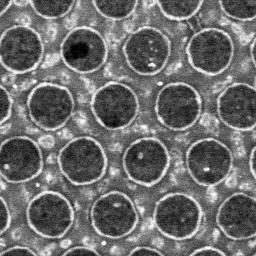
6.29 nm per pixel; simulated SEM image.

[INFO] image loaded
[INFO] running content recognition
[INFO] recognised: a regular array of raised bodies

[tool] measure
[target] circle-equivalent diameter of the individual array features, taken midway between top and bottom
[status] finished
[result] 287 nanometers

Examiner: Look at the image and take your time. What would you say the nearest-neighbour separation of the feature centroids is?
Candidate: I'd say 395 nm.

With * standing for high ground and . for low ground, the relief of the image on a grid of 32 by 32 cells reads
*...*****...*****...*****...****
.....***....*****...*****...****
.......................**.......
.***..............*.....*.......
*****...*****...****....*****...
*****...*****...*****...*****...
*****...*****...*****..******..*
*****...*****...*****...*****...
.***.....***....****....****....
................................
.....**.......*......**.........
*...*****...*****...*****...****
*...*****...*****...*****..*****
*...*****...*****..******..*****
*...*****...*****...*****..*****
.....***.....***....****....****
................................
.***.....***.....***......*.....
*****...*****...*****...****....
*****..******...*****..******..*
*****..******...*****..******..*
*****...*****...*****...*****..*
.***.....***.....***....****....
................................
.....***.....***.....**......**.
*...*****...*****...*****...****
*..******...*****..******..*****
*..******...*****..******..*****
*...*****...*****...*****...****
......**.....**......***....****
................................
****....****.....***....****....